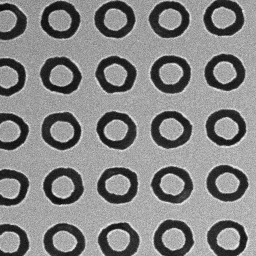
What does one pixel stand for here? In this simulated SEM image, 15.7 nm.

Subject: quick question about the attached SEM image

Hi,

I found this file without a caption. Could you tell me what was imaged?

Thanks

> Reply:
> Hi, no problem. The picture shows a regular array of ring-shaped grooves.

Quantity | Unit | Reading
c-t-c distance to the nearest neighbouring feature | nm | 850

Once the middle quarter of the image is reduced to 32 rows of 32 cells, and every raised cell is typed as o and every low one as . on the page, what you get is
...ooooo...ooo....oooo...oooo...
o...oooo..ooooo...oooo..ooooo...
oo..oooo..oooooo..oooo..oooooo..
oo...ooo..ooooo...oooo..ooooo...
oo..ooooo..oooo...oooo...ooo...o
....ooooo........oooooo........o
...ooooooo.......ooooooo......oo
.oooooooooo.oooooooooooooo.ooooo
oooooooooooooooooooooooooooooooo
oooooooooooooooooooooooooooooooo
oooooooooooooooooooooooooooooooo
oooooooooooooooooooooooooooooooo
..oooooooo......oooooooo.....ooo
...oooooo........ooooo.........o
....oooo....ooo..ooooo...oooo...
oo..oooo...ooooo..oooo..ooooo...
oo..oooo..oooooo..oooo..oooooo..
oo..oooo..ooooo...oooo..ooooo...
oo..ooooo..oooo...oooo....oo....
....ooooo........oooooo........o
...oooooooo......oooooo......ooo
oooooooooooooo.ooooooooooooooooo
oooooooooooooooooooooooooooooooo
oooooooooooooooooooooooooooooooo
oooooooooooooooooooooooooooooooo
ooooooooooooooooooooooooooo.oooo
...ooooooo.......ooooooo......oo
....ooooo.........ooooo........o
o...ooooo..ooooo...ooo...oooo...
oo...ooo...ooooo...ooo..oooooo..
oo...ooo..oooooo...ooo..oooooo..
oo...ooo...ooooo...ooo...ooooo..